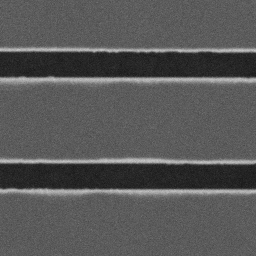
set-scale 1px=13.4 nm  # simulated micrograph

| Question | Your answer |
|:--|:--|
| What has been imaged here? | lines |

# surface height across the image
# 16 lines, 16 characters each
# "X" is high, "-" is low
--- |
XXXXXXXXXXXXXXXX
XXXXXXXXXXXXXXXX
XXXXXXXXXXXXXXXX
----------------
----------------
XXXXXXXXXXXXXXXX
XXXXXXXXXXXXXXXX
XXXXXXXXXXXXXXXX
XXXXXXXXXXXXXXXX
XXXXXXXXXXXXXXXX
----------------
----------------
XXXXXXXXXXXXXXXX
XXXXXXXXXXXXXXXX
XXXXXXXXXXXXXXXX
XXXXXXXXXXXXXXXX